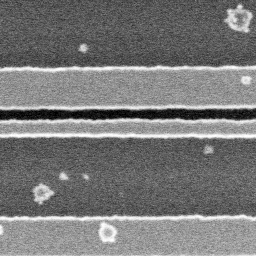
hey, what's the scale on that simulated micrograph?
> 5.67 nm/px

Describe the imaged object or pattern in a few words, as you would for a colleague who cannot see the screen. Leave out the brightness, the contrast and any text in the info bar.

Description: lines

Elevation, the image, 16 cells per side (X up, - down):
----------------
----------------
----------------
----------------
XXXXXXXXXXXXXXXX
XXXXXXXXXXXXXXXX
XXXXXXXXXXXXXXXX
XXXXXXXXXXXXXXXX
--------------XX
----------------
----------------
----------------
----------------
----------------
XXXXXXXXXXXXXXXX
XXXXXXXXXXXXXXXX